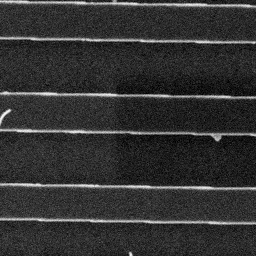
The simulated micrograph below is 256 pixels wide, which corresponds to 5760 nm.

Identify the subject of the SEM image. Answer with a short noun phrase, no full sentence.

lines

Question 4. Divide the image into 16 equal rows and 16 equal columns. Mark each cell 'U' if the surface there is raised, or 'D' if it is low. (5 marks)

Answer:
UUUUUUUUUUUUUUUU
UUUUUUUUUUUUUUUU
DDDDDUUUUUUUUUUU
DDDDDDDDDDDDDDDD
DDDDDDDDDDDDDDDD
DDDDDDDDDDDDDDDD
UUUUUUUUUUUUUUUU
UUUUUUUUUUUUUUUU
DDDDDDDDDDDDDDDD
DDDDDDDDDDDDDDDD
DDDDDDDDDDDDDDDD
DDDDDDDDDDDDDDDD
UUUUUUUUUUUUUUUU
UUUUUUUUUUUUUUUU
DDDDDDDDDDDDDDDD
DDDDDDDDDDDDDDDD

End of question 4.